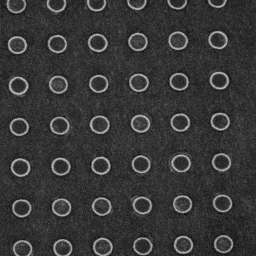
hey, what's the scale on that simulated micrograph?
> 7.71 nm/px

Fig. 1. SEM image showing a regular array of raised bodies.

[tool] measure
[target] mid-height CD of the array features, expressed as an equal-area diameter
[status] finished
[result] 0.133 microns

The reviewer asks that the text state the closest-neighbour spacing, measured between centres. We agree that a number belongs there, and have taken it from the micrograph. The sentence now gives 309 nm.